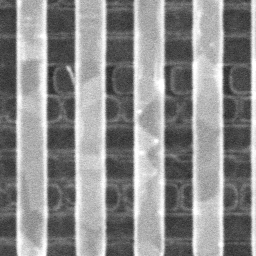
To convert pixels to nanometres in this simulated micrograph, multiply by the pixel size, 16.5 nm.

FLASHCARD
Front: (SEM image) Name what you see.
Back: wiring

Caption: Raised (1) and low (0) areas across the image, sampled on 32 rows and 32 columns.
00111100001110000111000011110000
00111100001110000111000011110000
00111100001110000111000011110000
00111100001110000111000011110000
00111100001110000111000011110000
00111100001110000111000011110000
00111100001110000111000011110000
00111100001110000111000011110000
00111100001110000111000011110000
00111000001110000111000011110000
00111000001110000111000011110000
00111100001110000111000011110000
00111100001110000111000011110000
00111100001110000111000011110000
00111100001110000111000011110000
00111100001110000111000011110000
00111100001110000111000011110000
00111100001110000111000011110000
00111100001110000111000011110000
00111100001110000111000011110000
00111100001110000111000011110000
00111100001110000111000011110000
00111100001110000111000011110000
00111100001110000111000011110000
00111100001110000111000011110000
00111100001110000111000011110000
00111100001110000111000011110000
00111100001110000111000011110000
00111100001110000111000011110000
00111100001110000111000011110000
00111100001110000111000011110000
00111100001110000111000011110000